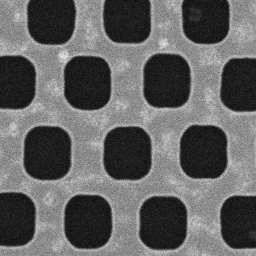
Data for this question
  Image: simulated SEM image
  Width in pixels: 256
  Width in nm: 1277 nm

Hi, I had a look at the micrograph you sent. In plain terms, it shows holes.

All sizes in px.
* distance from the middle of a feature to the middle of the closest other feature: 76.3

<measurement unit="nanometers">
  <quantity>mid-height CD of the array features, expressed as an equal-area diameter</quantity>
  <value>269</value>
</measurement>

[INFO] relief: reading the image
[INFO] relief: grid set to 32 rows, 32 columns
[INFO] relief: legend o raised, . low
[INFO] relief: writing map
oooo.....oooo......oooo......ooo
ooo......oooo......oooo......ooo
ooo......oooo......oooo......ooo
ooo......oooo......oooo......ooo
oooo.....oooo......oooo.....oooo
ooooo...ooooooooooooooooo..ooooo
oooooooooooooooooooooooooooooooo
....ooooo....oooooo....oooooo...
....oooo......oooo......oooo....
.....ooo......oooo......oooo....
.....ooo......oooo......oooo....
....oooo......oooo......oooo....
....oooo......oooo.....ooooo....
...oooooo....oooooooooooooooo...
oooooooooooooooooooooooooooooooo
oooooooooooooooooooooooooooooooo
oooo....oooooo....ooooo.....oooo
ooo......oooo......oooo.....oooo
ooo......oooo......ooo......oooo
ooo......oooo......ooo......oooo
ooo......oooo......oooo.....oooo
ooo.....ooooo......oooo.....oooo
ooooo..oooooooo..ooooooooooooooo
oooooooooooooooooooooooooooooooo
...ooooooo..ooooooo..oooooooo...
....oooo......oooo.....ooooo....
.....ooo......oooo.....ooooo....
....oooo......ooo......oooo.....
....oooo......ooo......ooooo....
....oooo......ooo......ooooo....
...oooooo....ooooo.....ooooo....
oooooooooooooooooooooooooooooooo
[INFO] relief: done